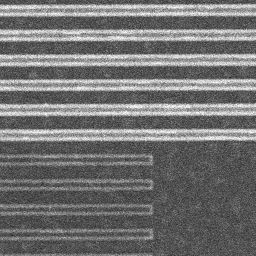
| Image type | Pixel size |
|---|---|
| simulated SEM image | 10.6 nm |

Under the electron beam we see parallel lines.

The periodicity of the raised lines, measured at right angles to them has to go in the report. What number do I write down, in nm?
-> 264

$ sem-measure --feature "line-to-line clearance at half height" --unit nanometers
179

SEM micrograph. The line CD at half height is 79.7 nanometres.